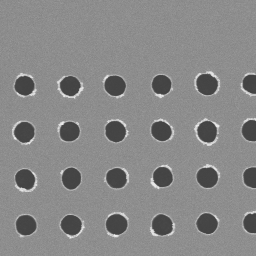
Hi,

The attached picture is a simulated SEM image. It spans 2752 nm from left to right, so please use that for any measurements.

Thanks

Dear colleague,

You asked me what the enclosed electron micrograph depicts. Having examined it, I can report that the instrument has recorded a regular array of holes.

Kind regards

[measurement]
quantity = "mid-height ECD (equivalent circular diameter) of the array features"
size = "219 nanometres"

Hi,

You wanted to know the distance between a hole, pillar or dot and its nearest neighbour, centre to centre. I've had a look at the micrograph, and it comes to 487 nm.